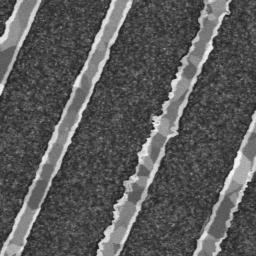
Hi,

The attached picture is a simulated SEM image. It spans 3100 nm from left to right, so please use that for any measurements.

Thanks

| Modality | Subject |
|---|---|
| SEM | one or a few lines or trenches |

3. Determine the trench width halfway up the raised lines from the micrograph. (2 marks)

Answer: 869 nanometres